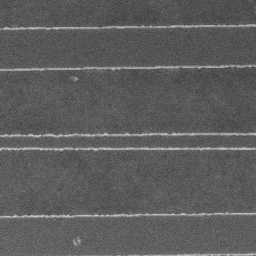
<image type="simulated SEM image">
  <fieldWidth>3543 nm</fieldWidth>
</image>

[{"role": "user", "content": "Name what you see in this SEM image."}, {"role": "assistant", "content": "lines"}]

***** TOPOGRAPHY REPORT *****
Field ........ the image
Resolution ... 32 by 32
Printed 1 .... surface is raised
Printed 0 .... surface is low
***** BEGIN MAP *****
00000000000000000000000000000000
00000000000000000000000000000000
00000000000000000000000000000000
00000000000011111111111111111111
11111111111111111111111111111111
11111111111111111111111111111111
11111111111111111111111111111111
11111111111111111111111111111111
11111111111111100000000000000000
00000000000000000000000000000000
00000000000000000000000000000000
00000000000000000000000000000000
00000000000000000000000000000000
00000000000000000000000000000000
00000000000000000000000000000000
00000000000000000000000000000000
00000000000000000000000000000000
11111111111111111111111111111111
11111111111111111111111111111111
00000000000000000000000000000000
00000000000000000000000000000000
00000000000000000000000000000000
00000000000000000000000000000000
00000000000000000000000000000000
00000000000000000000000000000000
00000000000000000000000000000000
00000000000000000000000000000000
11111111111111111111111111111111
11111111111111111111111111111111
11111111111111111111111111111111
11111111111111111111111111111111
11111111111111111111111111111111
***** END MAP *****